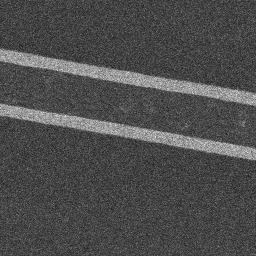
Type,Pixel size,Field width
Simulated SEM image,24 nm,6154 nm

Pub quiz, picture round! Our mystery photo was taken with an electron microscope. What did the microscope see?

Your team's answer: one or a few lines or trenches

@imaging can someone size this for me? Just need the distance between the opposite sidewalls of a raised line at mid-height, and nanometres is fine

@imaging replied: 1250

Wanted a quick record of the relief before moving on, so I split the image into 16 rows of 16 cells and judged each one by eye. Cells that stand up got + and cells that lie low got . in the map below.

................
................
................
................
++++++..........
++++++++++++....
++++++++++++++++
....++++++++++++
..........++++++
................
................
................
................
................
................
................